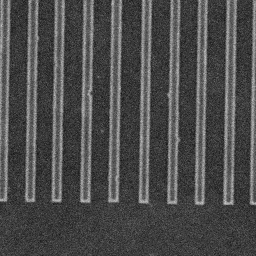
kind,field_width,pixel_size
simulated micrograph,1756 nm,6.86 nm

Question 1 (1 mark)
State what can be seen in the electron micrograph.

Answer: parallel lines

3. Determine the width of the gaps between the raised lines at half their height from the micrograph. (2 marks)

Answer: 143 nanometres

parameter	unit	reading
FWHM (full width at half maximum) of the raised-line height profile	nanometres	51.4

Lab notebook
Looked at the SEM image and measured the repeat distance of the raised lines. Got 194 nanometres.